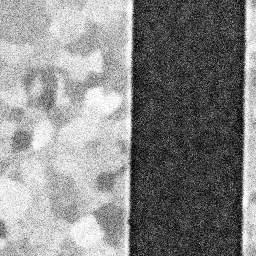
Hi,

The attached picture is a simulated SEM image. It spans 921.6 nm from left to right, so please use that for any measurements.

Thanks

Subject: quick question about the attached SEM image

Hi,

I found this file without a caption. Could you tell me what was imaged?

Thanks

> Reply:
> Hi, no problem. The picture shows one or a few lines or trenches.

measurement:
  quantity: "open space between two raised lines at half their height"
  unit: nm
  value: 419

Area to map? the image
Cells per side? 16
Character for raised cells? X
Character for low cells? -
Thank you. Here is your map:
XXXXXXXX-------X
XXXXXXXX-------X
XXXXXXXX-------X
XXXXXXXX-------X
XXXXXXXX-------X
XXXXXXXX-------X
XXXXXXXX-------X
XXXXXXXX-------X
XXXXXXXX-------X
XXXXXXXX-------X
XXXXXXXX-------X
XXXXXXXX-------X
XXXXXXXX-------X
XXXXXXXX-------X
XXXXXXXX-------X
XXXXXXXX-------X